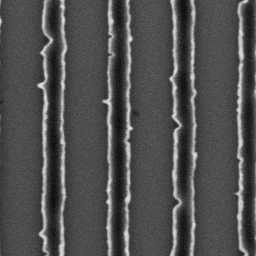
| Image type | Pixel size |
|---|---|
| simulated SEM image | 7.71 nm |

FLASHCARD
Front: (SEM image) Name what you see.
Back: one or a few lines or trenches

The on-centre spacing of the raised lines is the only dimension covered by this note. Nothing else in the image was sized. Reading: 502 nm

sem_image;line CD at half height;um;0.156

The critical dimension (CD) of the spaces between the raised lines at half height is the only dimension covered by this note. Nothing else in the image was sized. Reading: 0.345 micrometres